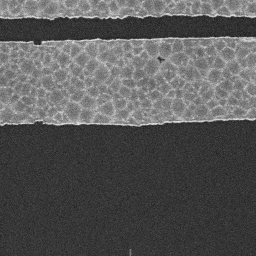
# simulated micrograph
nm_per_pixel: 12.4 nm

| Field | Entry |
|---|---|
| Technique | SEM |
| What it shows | one or a few lines or trenches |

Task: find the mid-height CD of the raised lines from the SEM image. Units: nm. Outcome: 850